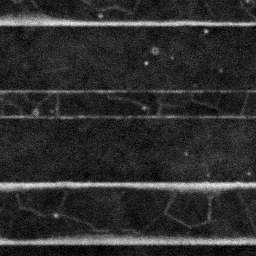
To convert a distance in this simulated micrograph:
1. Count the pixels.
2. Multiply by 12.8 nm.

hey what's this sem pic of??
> lines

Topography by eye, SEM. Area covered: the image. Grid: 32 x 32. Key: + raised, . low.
++++++++++++++++++++++++++++++++
++++++++++++++++++++++++++++++++
++++++++++++++++++++++++++++++++
................................
................................
................................
................................
................................
................................
................................
................................
++++++++++++++++++++++++++++++++
++++++++++++++++++++++++++++++++
++++++++++++++++++++++++++++++++
++++++++++++++++++++++++++++++++
................................
................................
................................
................................
................................
................................
................................
................................
++++++++++++++++++++++++++++++++
++++++++++++++++++++++++++++++++
++++++++++++++++++++++++++++++++
++++++++++++++++++++++++++++++++
++++++++++++++++++++++++++++++++
++++++++++++++++++++++++++++++++
++++++++++++++++++++++++++++++++
.++++++.........................
................................